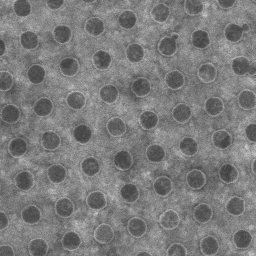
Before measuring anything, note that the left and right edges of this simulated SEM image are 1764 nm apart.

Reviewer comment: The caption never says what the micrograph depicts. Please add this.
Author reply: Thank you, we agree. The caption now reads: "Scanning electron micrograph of a regular array of raised bodies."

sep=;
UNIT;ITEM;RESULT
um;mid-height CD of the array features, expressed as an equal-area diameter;0.137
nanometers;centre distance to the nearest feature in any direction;230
